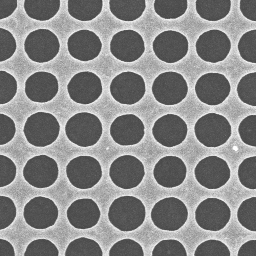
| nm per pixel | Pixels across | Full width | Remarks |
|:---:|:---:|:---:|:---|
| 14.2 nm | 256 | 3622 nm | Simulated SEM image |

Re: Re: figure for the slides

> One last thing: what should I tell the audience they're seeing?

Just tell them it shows a regular array of holes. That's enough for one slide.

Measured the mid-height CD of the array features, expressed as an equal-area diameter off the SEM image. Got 34.3 px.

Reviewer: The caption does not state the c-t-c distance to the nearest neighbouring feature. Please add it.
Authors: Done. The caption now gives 590 nm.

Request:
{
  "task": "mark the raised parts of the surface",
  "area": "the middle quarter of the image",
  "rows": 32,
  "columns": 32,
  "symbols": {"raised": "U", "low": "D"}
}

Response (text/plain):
UUUUUUUUUUUUUUUUUUUUUUUUUUUUUUUU
UUUUUUUUUUUUUUUUUUUUUUUUUUUUUUUU
UUUDDDDDUUUUUUDDDDUUUUUUDDDDDUUU
UUDDDDDDDUUUDDDDDDDDUUUDDDDDDDUU
UDDDDDDDDUUUDDDDDDDDUUDDDDDDDDDU
UDDDDDDDDDUUDDDDDDDDUUDDDDDDDDDU
UDDDDDDDDDUUDDDDDDDDUUDDDDDDDDDU
UDDDDDDDDUUUDDDDDDDDUUDDDDDDDDDU
UUDDDDDDUUUUDDDDDDDDUUUDDDDDDDUU
UUUDDDDUUUUUUUDDDDUUUUUUDDDDDUUU
UUUUUUUUUUUUUUUUUUUUUUUUUUUUUUUU
UUUUUUUUUUUUUUUUUUUUUUUUUUUUUUUU
UUUDDDDUUUUUUUUDDUUUUUUUUUDUUUUU
UUDDDDDDUUUUUDDDDDDUUUUUDDDDDUUU
UDDDDDDDDUUUDDDDDDDDUUUDDDDDDDUU
DDDDDDDDDDUUDDDDDDDDUUDDDDDDDDDU
DDDDDDDDDDUDDDDDDDDDUUDDDDDDDDDU
DDDDDDDDDUUUDDDDDDDDUUDDDDDDDDDU
UDDDDDDDDUUUDDDDDDDDUUUDDDDDDDUU
UUDDDDDDUUUUUDDDDDDUUUUDDDDDDDUU
UUUUDDDUUUUUUUUUUUUUUUUUUDDDUUUU
UUUUUUUUUUUUUUUUUUUUUUUUUUUUUUUU
UUUUUUUUUUUUUUUUUUUUUUUUUUUUUUUU
UUDDDDDDUUUUUDDDDDUUUUUUDDDDDUUU
UDDDDDDDDUUUDDDDDDDUUUUDDDDDDDUU
UDDDDDDDDUUUDDDDDDDDUUUDDDDDDDUU
DDDDDDDDDUUDDDDDDDDDUUDDDDDDDDDU
UDDDDDDDDDUDDDDDDDDDUUDDDDDDDDDU
UDDDDDDDDUUUDDDDDDDDUUUDDDDDDDUU
UDDDDDDDDUUUDDDDDDDUUUUDDDDDDDUU
UUDDDDDDUUUUUDDDDDUUUUUUDDDDUUUU
UUUUUUUUUUUUUUUUUUUUUUUUUUUUUUUU